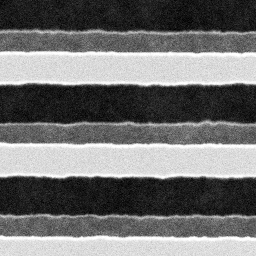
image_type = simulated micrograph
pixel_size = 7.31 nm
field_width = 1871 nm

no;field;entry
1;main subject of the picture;lines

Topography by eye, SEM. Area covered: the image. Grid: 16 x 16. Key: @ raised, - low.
----------------
----------------
@@@@@@@@@@@@@@@@
@@@@@@@@@@@@@@@@
@@@@@@@@@@@@@@@@
----------------
----------------
----------------
@@@@@@@@@@@@@@@@
@@@@@@@@@@@@@@@@
@@@@@@@@@@@@@@@@
----------------
----------------
--@--@----------
@@@@@@@@@@@@@@@@
@@@@@@@@@@@@@@@@